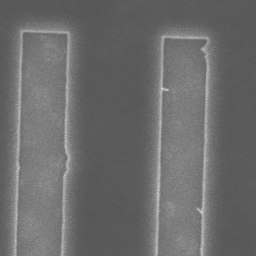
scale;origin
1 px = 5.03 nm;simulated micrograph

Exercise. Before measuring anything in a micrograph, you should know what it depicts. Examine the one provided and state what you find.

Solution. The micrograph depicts one or a few lines or trenches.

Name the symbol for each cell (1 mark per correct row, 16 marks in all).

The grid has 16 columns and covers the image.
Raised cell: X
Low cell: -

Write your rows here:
XXXXXXXXXXXXXXXX
XXXXXXXXXXXXXXXX
X---XXXXXX---XXX
X---XXXXXX---XXX
X---XXXXXX---XXX
X---XXXXXX---XXX
X---XXXXXX---XXX
X---XXXXXX---XXX
X---XXXXXX---XXX
X---XXXXXX---XXX
X---XXXXXX---XXX
X---XXXXXX---XXX
X---XXXXXX---XXX
X---XXXXXX---XXX
X---XXXXXX---XXX
X---XXXXXX---XXX